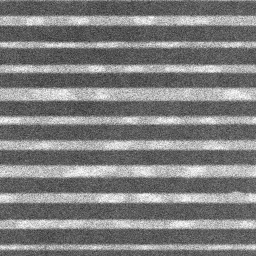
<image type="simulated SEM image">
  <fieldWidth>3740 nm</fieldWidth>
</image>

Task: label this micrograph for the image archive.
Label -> parallel lines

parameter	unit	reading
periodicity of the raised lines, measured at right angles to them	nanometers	371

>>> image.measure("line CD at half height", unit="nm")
245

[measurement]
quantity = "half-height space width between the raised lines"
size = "120 nm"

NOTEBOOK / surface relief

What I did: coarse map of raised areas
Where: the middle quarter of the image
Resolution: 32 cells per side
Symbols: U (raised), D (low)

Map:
DDDDDDDDDDDDDDDDDDDDDDDDDDDDDDDD
DDDDDDDDDDDDDDDDDDDDDDDDDDDDDDDD
UUUUUUUUUUUUUUUUUUUUUUUUUUUUUUUU
UUUUUUUUUUUUUUUUUUUUUUUUUUUUUUUU
UUUUUUUUUUUUUUUUUUUUUUUUUUUUUUUU
UUUUUUUUUUUUUUUUUUUUUUUUUUUUUUUU
DDDDDDDDDDDDDDDDDDDDDDDDDDDDDDDD
DDDDDDDDDDDDDDDDDDDDDDDDDDDDDDDD
DDDDDDDDDDDDDDDDDDDDDDDDDDDDDDDD
UUUUUUUUUUUUUUUUUUUUUUUUUUUUUUUU
UUUUUUUUUUUUUUUUUUUUUUUUUUUUUUUU
UUUUUUUUUUUUUUUUUUUUUUUUUUUUUUUU
UUUUUUUUUUUUUUUUUUUUUUUUUUUUUUUU
DDDDDDDDDDDDDDDDDDDDDDDDDDDDDDDD
DDDDDDDDDDDDDDDDDDDDDDDDDDDDDDDD
UUUUUUUUUUUUUUUUUUUUUUUUUUUUUUUU
UUUUUUUUUUUUUUUUUUUUUUUUUUUUUUUU
UUUUUUUUUUUUUUUUUUUUUUUUUUUUUUUU
UUUUUUUUUUUUUUUUUUUUUUUUUUUUUUUU
DDDDDDDDDDDDDDDDDDDDDDDDDDDDDDDD
DDDDDDDDDDDDDDDDDDDDDDDDDDDDDDDD
UUUUUUUUUUUUUUUUUUUUUUUUUUUUUUUU
UUUUUUUUUUUUUUUUUUUUUUUUUUUUUUUU
UUUUUUUUUUUUUUUUUUUUUUUUUUUUUUUU
UUUUUUUUUUUUUUUUUUUUUUUUUUUUUUUU
DDDDDDDDDDDDDDDDDDDDDDDDDDDDDDDD
DDDDDDDDDDDDDDDDDDDDDDDDDDDDDDDD
DDDDDDDDDDDDDDDDDDDDDDDDDDDDDDDD
UUUUUUUUUUUUUUUUUUUUUUUUUUUUUUUU
UUUUUUUUUUUUUUUUUUUUUUUUUUUUUUUU
UUUUUUUUUUUUUUUUUUUUUUUUUUUUUUUU
UUUUUUUUUUUUUUUUUUUUUUUUUUUUUUUU